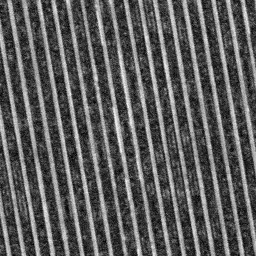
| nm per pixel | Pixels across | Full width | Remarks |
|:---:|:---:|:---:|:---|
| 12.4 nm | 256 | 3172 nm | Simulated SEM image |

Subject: parallel lines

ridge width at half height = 0.0367 microns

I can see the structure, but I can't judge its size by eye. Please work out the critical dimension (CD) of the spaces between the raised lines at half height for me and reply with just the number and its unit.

131 nm